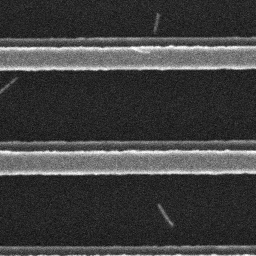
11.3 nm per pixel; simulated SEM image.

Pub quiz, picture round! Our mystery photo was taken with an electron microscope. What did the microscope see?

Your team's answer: lines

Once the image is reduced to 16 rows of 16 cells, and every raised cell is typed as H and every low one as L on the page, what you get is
LLLLLLLLLLLLLLLL
LLLLLLLLLLLLLLLL
HHHHHHHHHHHHHHHH
HHHHHHHHHHHHHHHH
LLLLLLLLLLLLLLLL
LLLLLLLLLLLLLLLL
LLLLLLLLLLLLLLLL
LLLLLLLLLLLLLLLL
LLLLLLLLLLLLLLLL
HHHHHHHHHHHHHHHH
HHHHHHHHHHHHHHHH
LLLLLLLLLLLLLLLL
LLLLLLLLLLLLLLLL
LLLLLLLLLLLLLLLL
LLLLLLLLLLLLLLLL
HHHHHHHHHHHHHHHH